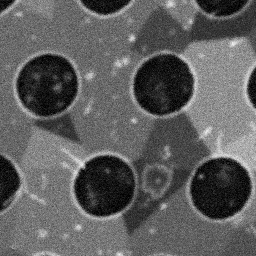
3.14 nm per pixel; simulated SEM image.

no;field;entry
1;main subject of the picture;holes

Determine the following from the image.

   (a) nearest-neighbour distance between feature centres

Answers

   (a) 365 nm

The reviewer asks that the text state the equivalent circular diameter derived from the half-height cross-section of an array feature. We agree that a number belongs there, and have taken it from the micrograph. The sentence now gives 201 nanometers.